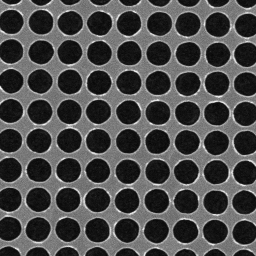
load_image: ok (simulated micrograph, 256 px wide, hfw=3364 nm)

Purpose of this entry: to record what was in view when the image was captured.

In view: a regular array of holes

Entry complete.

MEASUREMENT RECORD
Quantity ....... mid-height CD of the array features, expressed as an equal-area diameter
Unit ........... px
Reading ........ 24.8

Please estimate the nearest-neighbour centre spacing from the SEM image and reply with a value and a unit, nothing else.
383 nanometres